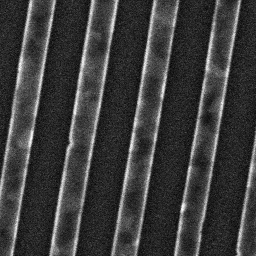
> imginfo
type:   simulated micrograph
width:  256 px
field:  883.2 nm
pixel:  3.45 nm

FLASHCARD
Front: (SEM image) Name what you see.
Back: one or a few lines or trenches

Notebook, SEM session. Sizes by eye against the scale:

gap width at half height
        130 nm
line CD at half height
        79.1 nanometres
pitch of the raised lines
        211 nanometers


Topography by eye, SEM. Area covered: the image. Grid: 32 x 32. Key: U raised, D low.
DDDDUUUDDDDDUUUDDDDUUUDDDDDUUUDD
DDDDUUUDDDDUUUDDDDDUUUDDDDDUUUDD
DDDUUUDDDDDUUUDDDDDUUUDDDDDUUUDD
DDDUUUDDDDDUUUDDDDDUUUDDDDDUUDDD
DDDUUUDDDDDUUUDDDDDUUUDDDDUUUDDD
DDDUUUDDDDDUUUDDDDDUUDDDDDUUUDDD
DDDUUUDDDDDUUUDDDDUUUDDDDDUUUDDD
DDDUUUDDDDUUUDDDDDUUUDDDDDUUUDDD
DDUUUDDDDDUUUDDDDDUUUDDDDDUUUDDD
DDUUUDDDDDUUUDDDDDUUUDDDDDUUDDDD
DDUUUDDDDDUUUDDDDDUUUDDDDUUUDDDD
DDUUUDDDDDUUUDDDDDUUDDDDDUUUDDDD
DDUUUDDDDDUUUDDDDUUUDDDDDUUUDDDD
DDUUUDDDDUUUDDDDDUUUDDDDDUUUDDDD
DDUUDDDDDUUUDDDDDUUUDDDDDUUUDDDD
DUUUDDDDDUUUDDDDDUUUDDDDDUUDDDDD
DUUUDDDDDUUUDDDDDUUUDDDDUUUDDDDD
DUUUDDDDDUUUDDDDDUUDDDDDUUUDDDDD
DUUUDDDDDUUDDDDDUUUDDDDDUUUDDDDD
DUUUDDDDUUUDDDDDUUUDDDDDUUUDDDDD
DUUDDDDDUUUDDDDDUUUDDDDDUUUDDDDU
UUUDDDDDUUUDDDDDUUUDDDDDUUDDDDDU
UUUDDDDDUUUDDDDDUUUDDDDUUUDDDDDU
UUUDDDDDUUUDDDDDUUDDDDDUUUDDDDDU
UUUDDDDDUUDDDDDUUUDDDDDUUUDDDDDU
UUUDDDDUUUDDDDDUUUDDDDDUUUDDDDDU
UUDDDDDUUUDDDDDUUUDDDDDUUUDDDDUU
UUDDDDDUUUDDDDDUUUDDDDDUUDDDDDUU
UUDDDDDUUUDDDDDUUUDDDDUUUDDDDDUU
UUDDDDDUUUDDDDUUUDDDDDUUUDDDDDUU
UUDDDDDUUDDDDDUUUDDDDDUUUDDDDDUU
UUDDDDUUUDDDDDUUUDDDDDUUUDDDDDUU